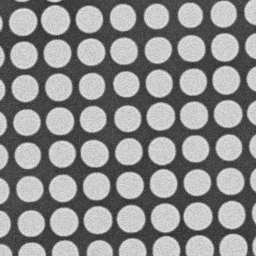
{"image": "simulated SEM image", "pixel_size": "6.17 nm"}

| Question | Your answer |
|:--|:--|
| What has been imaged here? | an array of small figures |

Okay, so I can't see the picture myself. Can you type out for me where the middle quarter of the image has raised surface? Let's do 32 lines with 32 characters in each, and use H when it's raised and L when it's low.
LLLLLLLLLLLLLLLLLLLLLLLLLLLLLLLL
LLLLLLLLLLLLLLLLLLLLLLLHLLLLLLLH
LLLLLLHHLLLLLLHHHHLLLHHHHHLLLLHH
HLLLLHHHHHLLLHHHHHLLLHHHHHHLLHHH
HHLLHHHHHHLLHHHHHHHLLHHHHHHLLHHH
HHLLHHHHHHLLHHHHHHHLLHHHHHHLLHHH
HHLLHHHHHHLLLHHHHHLLLHHHHHHLLLHH
HHLLHHHHHHLLLHHHHHLLLLHHHHLLLLLH
HLLLLHHHLLLLLLLLLLLLLLLLLLLLLLLL
LLLLLLLLLLLLLLLLLLLLLLLLLLLLLLLL
LLLLLLLLLLLLLLLHHLLLLLHHHHLLLLHH
HLLLLHHHHHLLLHHHHHLLLHHHHHHLLHHH
HHLLHHHHHHLLLHHHHHHLLHHHHHHHLHHH
HHLLHHHHHHLLLHHHHHHLLHHHHHHHLHHH
HHLLHHHHHHLLLHHHHHHLLHHHHHHLLHHH
HHLLHHHHHHLLLHHHHHHLLLHHHHHLLLHH
HHLLLHHHHLLLLLHHHHLLLLLHHLLLLLLL
HLLLLLLLLLLLLLLLLLLLLLLLLLLLLLLL
LLLLLLLLLLLLLLLLLLLLLLLHHLLLLLLH
HLLLLLHHHLLLLLHHHHLLLLHHHHHLLLHH
HHLLLHHHHHLLLHHHHHHLLHHHHHHHLLHH
HHHLHHHHHHHLLHHHHHHLLHHHHHHHLLHH
HHHLHHHHHHHLLHHHHHHLLHHHHHHHLLHH
HHHLHHHHHHHLLHHHHHHLLLHHHHHHLLHH
HHLLLHHHHHHLLLHHHHLLLLLHHHLLLLLL
HLLLLLLHHLLLLLLLLLLLLLLLLLLLLLLL
LLLLLLLLLLLLLLLLLLLLLLLLHHLLLLLL
LLLLLLLHHHLLLLLHHHLLLLHHHHHLLLLH
HHLLLLHHHHHLLLHHHHHLLLHHHHHHLLHH
HHHLLHHHHHHLLHHHHHHHLLHHHHHHLLHH
HHHLLHHHHHHLLHHHHHHHLLHHHHHHLLHH
HHHLLHHHHHHLLHHHHHHHLLHHHHHHLLLH